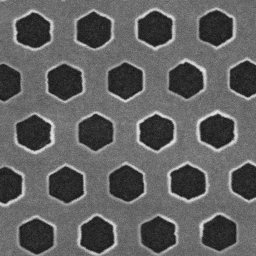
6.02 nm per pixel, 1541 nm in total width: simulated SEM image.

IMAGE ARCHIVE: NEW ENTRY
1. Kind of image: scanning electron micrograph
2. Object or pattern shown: a regular array of holes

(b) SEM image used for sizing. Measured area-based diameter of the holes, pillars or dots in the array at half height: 211 nm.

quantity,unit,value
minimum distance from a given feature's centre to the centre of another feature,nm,357